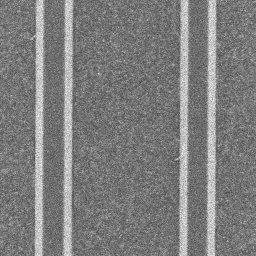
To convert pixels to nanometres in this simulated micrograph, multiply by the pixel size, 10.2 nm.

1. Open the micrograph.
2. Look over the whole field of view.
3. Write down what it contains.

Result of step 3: one or a few lines or trenches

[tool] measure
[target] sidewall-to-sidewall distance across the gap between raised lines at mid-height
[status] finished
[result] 1180 nanometers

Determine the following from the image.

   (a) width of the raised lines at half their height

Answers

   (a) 0.293 um